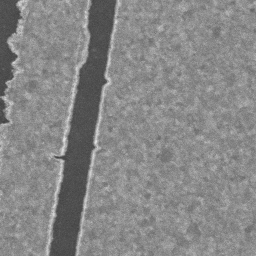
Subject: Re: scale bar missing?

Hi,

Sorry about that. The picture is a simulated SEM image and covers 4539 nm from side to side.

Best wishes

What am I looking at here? one or a few lines or trenches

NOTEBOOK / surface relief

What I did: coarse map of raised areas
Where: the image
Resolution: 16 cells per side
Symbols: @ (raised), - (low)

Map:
-@@@@--@@@@@@@@@
-@@@@--@@@@@@@@@
-@@@@--@@@@@@@@@
-@@@@--@@@@@@@@@
-@@@@--@@@@@@@@@
@@@@@--@@@@@@@@@
@@@@--@@@@@@@@@@
@@@@--@@@@@@@@@@
@@@@--@@@@@@@@@@
@@@@--@@@@@@@@@@
@@@@--@@@@@@@@@@
@@@@--@@@@@@@@@@
@@@--@@@@@@@@@@@
@@@--@@@@@@@@@@@
@@@--@@@@@@@@@@@
@@@--@@@@@@@@@@@